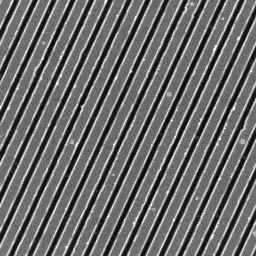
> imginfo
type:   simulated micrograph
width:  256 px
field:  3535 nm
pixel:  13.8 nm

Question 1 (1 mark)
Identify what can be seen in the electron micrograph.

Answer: parallel lines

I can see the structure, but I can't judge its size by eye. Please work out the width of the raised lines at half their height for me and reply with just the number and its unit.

168 nanometers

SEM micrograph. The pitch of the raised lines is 236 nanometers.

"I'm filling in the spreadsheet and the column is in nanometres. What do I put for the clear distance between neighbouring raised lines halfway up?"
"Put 72.1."